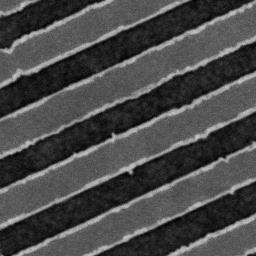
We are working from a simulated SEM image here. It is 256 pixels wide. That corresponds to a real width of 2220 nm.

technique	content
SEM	one or a few lines or trenches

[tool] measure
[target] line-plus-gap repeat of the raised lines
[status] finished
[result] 558 nm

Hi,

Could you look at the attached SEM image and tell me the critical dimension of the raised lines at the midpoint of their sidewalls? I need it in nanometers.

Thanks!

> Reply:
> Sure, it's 293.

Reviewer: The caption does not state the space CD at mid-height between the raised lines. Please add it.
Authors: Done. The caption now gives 261 nanometres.